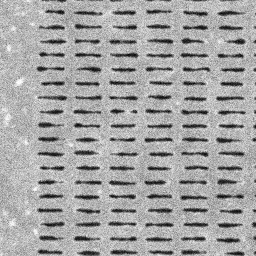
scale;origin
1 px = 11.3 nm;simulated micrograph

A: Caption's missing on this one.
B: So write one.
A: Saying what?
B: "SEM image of a regular array of holes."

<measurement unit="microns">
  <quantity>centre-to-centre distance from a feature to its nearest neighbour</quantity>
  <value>0.159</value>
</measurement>